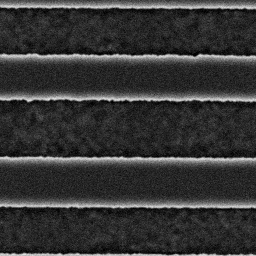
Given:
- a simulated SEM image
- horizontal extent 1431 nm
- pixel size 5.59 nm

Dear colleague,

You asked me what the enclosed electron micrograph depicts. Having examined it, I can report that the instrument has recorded lines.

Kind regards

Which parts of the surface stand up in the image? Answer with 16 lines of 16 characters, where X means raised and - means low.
---XXXXXXXXXXXXX
----------------
----------------
XXXXXXXXXXXXXXXX
XXXXXXXXXXXXXXXX
XXXXXXXXXXXXXXXX
----------------
----------------
----------------
----------------
XXXXXXXXXXXXXXXX
XXXXXXXXXXXXXXXX
XXXXXXXXXXXXXXXX
----------------
----------------
----------------